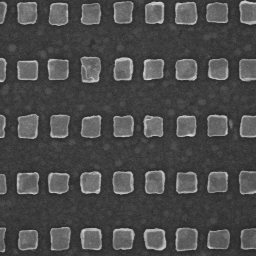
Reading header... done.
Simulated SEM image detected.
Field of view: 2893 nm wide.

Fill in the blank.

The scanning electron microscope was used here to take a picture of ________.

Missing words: a regular array of raised bodies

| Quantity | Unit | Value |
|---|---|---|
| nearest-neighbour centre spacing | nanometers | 354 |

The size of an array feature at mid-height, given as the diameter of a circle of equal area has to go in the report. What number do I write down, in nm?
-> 248